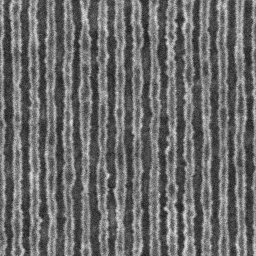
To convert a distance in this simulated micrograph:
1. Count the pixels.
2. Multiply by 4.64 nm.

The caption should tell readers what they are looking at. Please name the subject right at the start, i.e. parallel lines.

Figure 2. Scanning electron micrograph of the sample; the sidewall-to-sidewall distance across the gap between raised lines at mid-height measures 43 nanometers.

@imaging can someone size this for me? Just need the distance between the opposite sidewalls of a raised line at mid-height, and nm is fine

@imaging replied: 35.4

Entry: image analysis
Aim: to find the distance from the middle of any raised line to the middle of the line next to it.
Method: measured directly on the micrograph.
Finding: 17.2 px